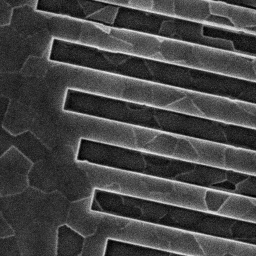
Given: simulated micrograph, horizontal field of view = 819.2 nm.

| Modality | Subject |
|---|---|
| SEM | parallel lines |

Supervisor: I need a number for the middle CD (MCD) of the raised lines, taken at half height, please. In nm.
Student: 75.4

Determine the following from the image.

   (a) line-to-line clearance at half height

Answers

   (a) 69.9 nanometers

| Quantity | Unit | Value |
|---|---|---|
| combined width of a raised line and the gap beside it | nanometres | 148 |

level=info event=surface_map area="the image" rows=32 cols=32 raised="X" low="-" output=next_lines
XXXXX---------XXXXXXXXXXXXXXX--X
XXXXXX-------X-----XXXXXXXXXXXXX
XXXXXXXXXX---X---------XXXXXXXXX
XXXXXXXXXXXXXX--------------XXXX
XXXXXXXXXXXXXXXXXXXX------------
XXXXXXX---XXXXXXXXXXXXXX--------
XXXXXX--------XXXXXXXXXXXXXXX---
XXXXXXX------------XXXXXXXXXXXXX
XXXXXXXXXXX-------------XXXXXXXX
XXXXXXXXXXXXXXX-------------XXXX
XXXXXXXXXXXXXXXXXXXX------------
XXXXXXXX---XXXXXXXXXXXXXX-------
XXXXXXXX-------XXXXXXXXXXXXXXX--
XXXXXXXX------------XXXXXXXXXXXX
XXXXXXXXXXXX-------------XXXXXXX
XXXXXXXXXXXXXXXX-------------XXX
XXXXXXXXXXXXXXXXXXXXX-----------
XXXXXXXXXX-XXXXXXXXXXXXXX-------
XXXXXXXXXX------XXXXXXXXXXXXXX--
XXXXXXXXXX----------XXXXXXXXXXXX
XXXXXXXXXXXX-------------XXXXXXX
XXXXXXXXXXXXXXXXX-------------XX
XXXXXXXXXXXXXXXXXXXXX-----------
XXXXXXXXXXXXXXXXXXXXXXXXXX------
XXXXXXXXXXXX----XXXXXXXXXXXXXX--
XXXXXXXXXXX----------XXXXXXXXXXX
XXXXXXXXXXXXX------------XXXXXXX
XXXXXXXXXXXXXXXXX-------------XX
XXXXXXXXXXXXXXXXXXXXXX----------
XXXXXXXXXXXXXXXXXXXXXXXXXXX-----
XXXXXXXXXXXXX----XXXXXXXXXXXXXX-
XXXXXXXXXXXXX--------XXXXXXXXXXX